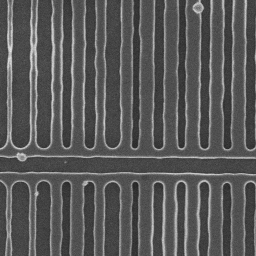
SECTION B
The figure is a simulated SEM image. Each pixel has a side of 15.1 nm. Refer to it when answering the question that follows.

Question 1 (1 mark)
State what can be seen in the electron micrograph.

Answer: groups of lines, slits or small figures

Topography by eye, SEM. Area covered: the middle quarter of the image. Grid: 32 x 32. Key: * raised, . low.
..***...**....***..***...***..**
..***...**....***..***...***..**
..***...**....***..***...***...*
..***...**....***..***...***...*
..***...**....***..***...***...*
..***...**....***..****..***...*
..***...**....***..***...***...*
..***...**....***..***...***..**
..***...**....***..***...***..**
..***...**....***..***...***..**
..***...**....***..***...***...*
..***...**....***..***...***...*
..***...**....***..***...***...*
..***...**....***..***...***...*
..***...**....***..***...***...*
..***...**....***..***...***...*
..***...**....***..***...***..**
..***...**....***..***...***..**
..***...**....***..***...***..**
..***...**....***..***...***..**
.****...***..****.****...***..**
********************************
********************************
................................
................................
................................
................................
********..*****************..***
********************************
.*****.*************************
..***...**....***..***...***..**
..***...**....***..***...***...*